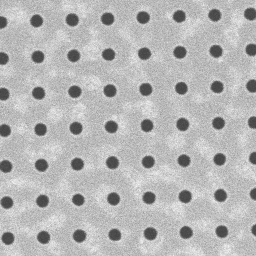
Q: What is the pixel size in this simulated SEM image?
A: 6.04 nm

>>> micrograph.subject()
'a regular array of holes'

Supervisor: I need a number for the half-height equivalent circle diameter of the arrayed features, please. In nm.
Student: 75.9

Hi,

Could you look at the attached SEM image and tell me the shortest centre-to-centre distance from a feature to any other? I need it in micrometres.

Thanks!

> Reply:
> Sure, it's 0.215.